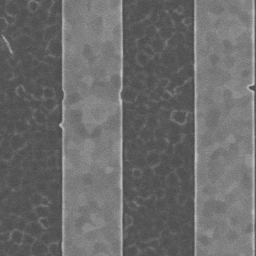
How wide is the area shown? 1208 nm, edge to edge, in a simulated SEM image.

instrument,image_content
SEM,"one or a few lines or trenches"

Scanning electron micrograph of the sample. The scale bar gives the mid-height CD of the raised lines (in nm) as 284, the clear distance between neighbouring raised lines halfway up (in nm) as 343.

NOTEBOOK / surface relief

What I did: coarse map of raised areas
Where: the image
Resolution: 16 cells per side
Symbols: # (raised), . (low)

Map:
....####....####
....####....####
....####....####
....####....####
....####....####
....####....####
....####....####
....####....####
....####....####
....####....####
....####....####
....####....####
....####....####
....####....####
....####....####
....####....####